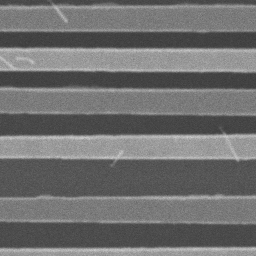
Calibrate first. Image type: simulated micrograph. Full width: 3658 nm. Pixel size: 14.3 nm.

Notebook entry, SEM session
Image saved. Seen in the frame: lines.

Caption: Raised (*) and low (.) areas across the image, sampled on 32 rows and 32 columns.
................................
********************************
********************************
********************************
................................
................................
********************************
********************************
********************************
................................
................................
********************************
********************************
********************************
................................
................................
................................
********************************
********************************
********************************
................................
................................
................................
................................
................................
********************************
********************************
********************************
................................
................................
................................
********************************